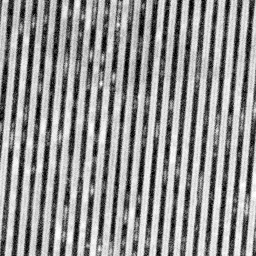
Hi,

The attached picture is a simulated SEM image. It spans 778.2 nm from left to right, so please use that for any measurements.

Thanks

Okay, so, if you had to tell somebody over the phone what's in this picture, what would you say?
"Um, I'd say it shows parallel lines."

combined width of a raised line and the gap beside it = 36.4 nm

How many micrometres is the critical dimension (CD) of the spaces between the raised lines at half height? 0.0185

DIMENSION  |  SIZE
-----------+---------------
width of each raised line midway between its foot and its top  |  18.2 nm